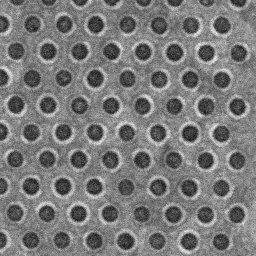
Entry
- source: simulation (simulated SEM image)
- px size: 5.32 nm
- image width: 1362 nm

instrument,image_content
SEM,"a regular array of holes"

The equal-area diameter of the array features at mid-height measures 97.2 nm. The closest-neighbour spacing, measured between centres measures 31 pixels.